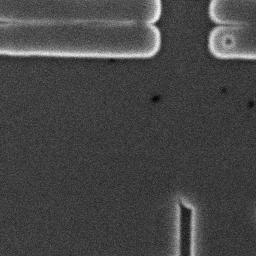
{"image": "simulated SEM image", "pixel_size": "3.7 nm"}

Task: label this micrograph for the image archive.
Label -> wiring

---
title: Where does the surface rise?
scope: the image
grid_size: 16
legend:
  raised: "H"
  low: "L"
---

HHHHHHHHHHLLLHHH
HHHHHHHHHHLLLLHH
HHHHHHHHHHLLLHHH
LLLLLLHHHLLLLLHH
LLLLLLLLLLLLLLLL
LLLLLLLLLLLLLLLL
LLLLLLLLLLLLLLLL
LLLLLLLLLLLLLLLL
LLLLLLLLLLLLLLLL
LLLLLLLLLLLLLLLL
LLLLLLLLLLLLLLLL
LLLLLLLLLLLLLLLL
LLLLLLLLLLLLLLLL
LLLLLLLLLLLLLLLL
LLLLLLLLLLLLLLLL
LLLLLLLLLLLLLLLL